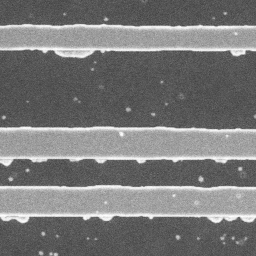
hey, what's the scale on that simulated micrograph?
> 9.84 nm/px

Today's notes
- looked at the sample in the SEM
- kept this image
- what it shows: lines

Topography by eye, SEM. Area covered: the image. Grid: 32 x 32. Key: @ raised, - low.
--------------------------------
--------------------------------
--------------------------------
@@@@@@@@@@@@@@@@@@@@@@@@@@@@@@@@
@@@@@@@@@@@@@@@@@@@@@@@@@@@@@@@@
@@@@@@@@@@@@@@@@@@@@@@@@@@@@@@@@
---------@@---------------------
--------------------------------
--------------------------------
--------------------------------
--------------------------------
--------------------------------
--------------------------------
--------------------------------
--------------------------------
--------------------------------
@@@@@@@@@@@@@@@@@@@@@@@@@@@@@@@@
@@@@@@@@@@@@@@@@@@@@@@@@@@@@@@@@
@@@@@@@@@@@@@@@@@@@@@@@@@@@@@@@@
@@@@@@@@@@@@@@@@@@@@@@@@@@@@@@@@
--------------------------------
--------------------------------
--------------------------------
@@@@@@@@@@@@@@@@@@@@@@@@@@@@@@@@
@@@@@@@@@@@@@@@@@@@@@@@@@@@@@@@@
@@@@@@@@@@@@@@@@@@@@@@@@@@@@@@@@
@@@@@@@@@@@@@@@@@@@@@@@@@@@@@@@@
--------------------------------
--------------------------------
--------------------------------
--------------------------------
--------------------------------